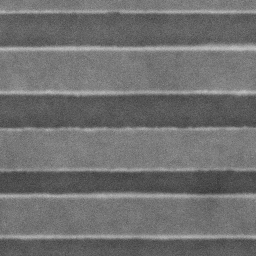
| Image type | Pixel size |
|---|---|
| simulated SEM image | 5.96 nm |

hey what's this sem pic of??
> lines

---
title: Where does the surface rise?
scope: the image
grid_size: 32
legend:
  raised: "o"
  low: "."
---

oooooooooooooooooooooooooooooooo
ooo.ooo.o......oooo.ooooo..ooo.o
................................
................................
................................
................................
oooooooooooooooooooooooooooooooo
oooooooooooooooooooooooooooooooo
oooooooooooooooooooooooooooooooo
oooooooooooooooooooooooooooooooo
oooooooooooooooooooooooooooooooo
........oo......................
................................
................................
................................
................................
oooooooooooooooooooooooooooooooo
oooooooooooooooooooooooooooooooo
oooooooooooooooooooooooooooooooo
oooooooooooooooooooooooooooooooo
oooooooooooooooooooooooooooooooo
................................
................................
................................
oooooooooooooooooooooooooooooooo
oooooooooooooooooooooooooooooooo
oooooooooooooooooooooooooooooooo
oooooooooooooooooooooooooooooooo
oooooooooooooooooooooooooooooooo
oooooooooooooooooooooooooooooooo
................................
................................